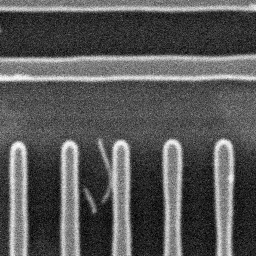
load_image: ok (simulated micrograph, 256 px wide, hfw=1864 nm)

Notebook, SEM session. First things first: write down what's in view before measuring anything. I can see groups of lines, slits or small figures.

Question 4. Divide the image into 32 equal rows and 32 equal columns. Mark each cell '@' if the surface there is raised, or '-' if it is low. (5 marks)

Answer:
@@@@@@@@@@@@@@@@@@@@@@@@@@@@@@@@
--------------------------------
--------------------------------
--------------------------------
--------------------------------
--------------------------------
--------------------------------
@@@@@@@@@@@@@@@@@@@@@@@@@@@@@@@@
@@@@@@@@@@@@@@@@@@@@@@@@@@@@@@@@
@@@@@@@@@@@@@@@@@@@@@@@@@@@@@@@@
--------------------------------
--------------------------------
--------------------------------
--------------------------------
--------------------------------
--------------------------------
--------------------------------
--------------------------------
--@-----@@----@@-----@-----@@---
-@@-----@@----@@-----@@----@@---
-@@-----@@----@@-----@@----@@---
-@@-----@@----@@-----@@----@@---
-@@-----@@----@@-----@@----@@---
-@@-----@@----@@-----@@----@@---
-@@-----@@----@@-----@-----@@---
-@@-----@@----@@-----@-----@@---
-@@-----@@----@@-----@-----@@---
-@@-----@@----@@-----@-----@@---
-@@-----@@----@@-----@-----@@---
-@@-----@@----@@-----@-----@@---
-@@-----@@----@@-----@-----@@---
-@@-----@@----@@-----@@----@@---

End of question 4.